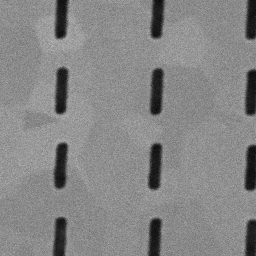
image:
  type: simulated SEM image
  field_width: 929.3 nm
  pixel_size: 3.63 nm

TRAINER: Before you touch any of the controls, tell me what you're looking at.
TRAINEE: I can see holes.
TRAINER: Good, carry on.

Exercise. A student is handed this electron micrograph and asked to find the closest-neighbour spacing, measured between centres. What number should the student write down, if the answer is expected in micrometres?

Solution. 0.272